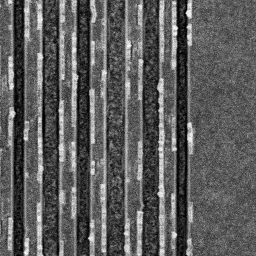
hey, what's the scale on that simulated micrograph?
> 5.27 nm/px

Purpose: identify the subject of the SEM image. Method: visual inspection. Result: parallel lines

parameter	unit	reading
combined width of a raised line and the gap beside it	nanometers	177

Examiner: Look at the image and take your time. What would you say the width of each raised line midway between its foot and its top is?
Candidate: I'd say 0.0864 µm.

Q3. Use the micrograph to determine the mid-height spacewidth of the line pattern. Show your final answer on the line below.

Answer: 15.9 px